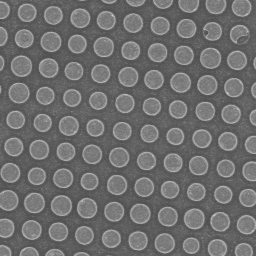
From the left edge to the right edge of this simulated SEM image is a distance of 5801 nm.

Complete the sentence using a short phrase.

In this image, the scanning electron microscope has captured a regular array of raised bodies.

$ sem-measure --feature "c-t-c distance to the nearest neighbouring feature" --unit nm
595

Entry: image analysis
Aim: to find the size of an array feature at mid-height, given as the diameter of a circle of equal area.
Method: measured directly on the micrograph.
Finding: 427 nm